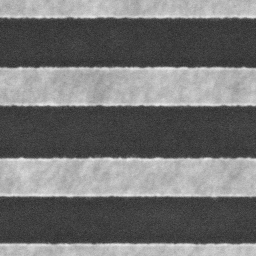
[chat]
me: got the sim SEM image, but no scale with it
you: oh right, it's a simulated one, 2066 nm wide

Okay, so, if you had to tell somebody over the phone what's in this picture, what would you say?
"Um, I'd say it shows lines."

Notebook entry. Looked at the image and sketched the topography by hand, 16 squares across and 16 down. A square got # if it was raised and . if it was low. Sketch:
################
................
................
................
################
################
################
................
................
................
################
################
................
................
................
################